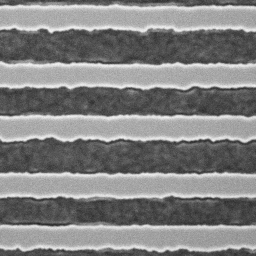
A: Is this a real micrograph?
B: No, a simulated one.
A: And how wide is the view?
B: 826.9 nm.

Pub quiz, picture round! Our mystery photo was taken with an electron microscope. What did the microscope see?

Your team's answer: lines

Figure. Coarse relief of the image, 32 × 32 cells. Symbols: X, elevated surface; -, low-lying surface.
--------------------------------
XXXXXXXXXXXXXXXXXXXXXXXXXXXXXXXX
XXXXXXXXXXXXXXXXXXXXXXXXXXXXXXXX
XXXXXXXXXXXXXXXXXXXXXXXXXXXXXXXX
--------------------------------
--------------------------------
--------------------------------
--------------------------------
XXXXXXXXXXXXXXXXXXXXXXXXXXXXXXXX
XXXXXXXXXXXXXXXXXXXXXXXXXXXXXXXX
XXXXXXXXXXXXXXXXXXXXXXXXXXXXXXXX
--------------------------------
--------------------------------
--------------------------------
---XXX--XXXX--XXXXX---X-X---X---
XXXXXXXXXXXXXXXXXXXXXXXXXXXXXXXX
XXXXXXXXXXXXXXXXXXXXXXXXXXXXXXXX
XXXX---XX---XX--XXXX-XXXX-X--XX-
--------------------------------
--------------------------------
--------------------------------
--------------------------------
XXXXXXXXXXXXXXXXXXXXXXXXXXXXXXXX
XXXXXXXXXXXXXXXXXXXXXXXXXXXXXXXX
XXXXXXXXXXXXXXXXXXXXX-XXXXXXXXXX
--------------------------------
------X-------------------------
--------------------------------
XXXXXXXXXXXXXXXXXXXXXXXXXXXXXXXX
XXXXXXXXXXXXXXXXXXXXXXXXXXXXXXXX
XXXXXXXXXXXXXXXXXXXXXXXXXXXXXXXX
--------------------------------